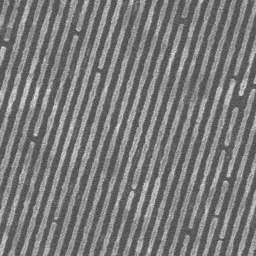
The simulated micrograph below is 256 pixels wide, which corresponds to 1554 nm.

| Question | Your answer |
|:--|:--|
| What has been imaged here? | parallel lines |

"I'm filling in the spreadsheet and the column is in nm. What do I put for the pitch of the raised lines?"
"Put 66.2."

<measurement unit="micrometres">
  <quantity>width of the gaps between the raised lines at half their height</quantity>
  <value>0.0436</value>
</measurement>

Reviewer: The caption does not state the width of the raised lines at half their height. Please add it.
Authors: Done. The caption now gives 21.8 nanometers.